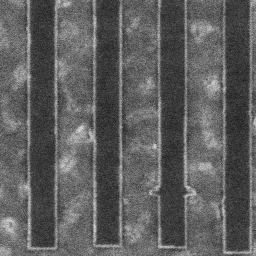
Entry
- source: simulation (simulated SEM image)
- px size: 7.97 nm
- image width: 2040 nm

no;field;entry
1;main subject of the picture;one or a few lines or trenches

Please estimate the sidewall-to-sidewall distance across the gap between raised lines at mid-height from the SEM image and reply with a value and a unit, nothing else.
37.4 pixels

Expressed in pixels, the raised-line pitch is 65.1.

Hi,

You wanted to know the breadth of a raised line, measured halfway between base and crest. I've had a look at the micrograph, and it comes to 217 nanometres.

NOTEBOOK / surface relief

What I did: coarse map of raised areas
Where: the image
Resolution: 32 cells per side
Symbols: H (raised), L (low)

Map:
LLLLHHHLLLLLHHHLLLLLHHHLLLLLHHHL
LLLHHHHLLLLLHHHLLLLLHHHLLLLLHHHL
LLLHHHHLLLLLHHHLLLLLHHHLLLLLHHHL
LLLHHHHLLLLLHHHLLLLLHHHLLLLLHHHL
LLLHHHHLLLLLHHHLLLLLHHHLLLLLHHHL
LLLHHHHLLLLLHHHLLLLLHHHLLLLLHHHL
LLLHHHHLLLLLHHHLLLLLHHHLLLLLHHHL
LLLHHHHLLLLLHHHLLLLLHHHLLLLLHHHL
LLLHHHHLLLLLHHHLLLLLHHHLLLLLHHHL
LLLHHHHLLLLLHHHLLLLLHHHLLLLLHHHL
LLLHHHHLLLLLHHHLLLLLHHHLLLLLHHHL
LLLLHHHLLLLLHHHLLLLLHHHLLLLLHHHL
LLLLHHHLLLLLHHHLLLLLHHHLLLLLHHHL
LLLLHHHLLLLLHHHLLLLLHHHLLLLLHHHL
LLLLHHHLLLLLHHHLLLLLHHHLLLLLHHHL
LLLHHHHLLLLLHHHLLLLLHHHLLLLLHHHL
LLLLHHHLLLLLHHHLLLLLHHHLLLLLHHHL
LLLLHHHLLLLLHHHLLLLLHHHLLLLLHHHL
LLLLHHHLLLLLHHHLLLLLHHHLLLLLHHHL
LLLLHHHLLLLLHHHLLLLLHHHLLLLLHHHL
LLLLHHHLLLLLHHHLLLLLHHHLLLLLHHHL
LLLLHHHLLLLLHHHLLLLLHHHLLLLLHHHL
LLLLHHHLLLLLHHHLLLLLHHHLLLLLHHHL
LLLLHHHLLLLLHHHLLLLLHHHHLLLLHHHL
LLLLHHHLLLLLHHHLLLLLHHHHLLLLHHHL
LLLLHHHLLLLLHHHLLLLLHHHLLLLLHHHL
LLLLHHHLLLLLHHHLLLLLHHHLLLLLHHHL
LLLLHHHLLLLLHHHLLLLLHHHLLLLLHHHL
LLLLHHHLLLLLHHHLLLLLHHHLLLLLHHHL
LLLHHHHLLLLLHHHLLLLLHHHLLLLLHHHL
LLLHHHHLLLLLHHHLLLLLHHHLLLLLHHHL
LLLLLLLLLLLLLLLLLLLLLLLLLLLLHHHL